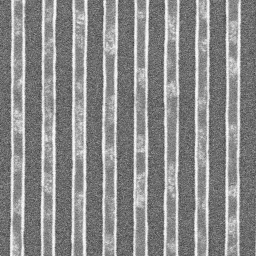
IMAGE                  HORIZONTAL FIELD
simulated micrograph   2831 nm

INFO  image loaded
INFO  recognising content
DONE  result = parallel lines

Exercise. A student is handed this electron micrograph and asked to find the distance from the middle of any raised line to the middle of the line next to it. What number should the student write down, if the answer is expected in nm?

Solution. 340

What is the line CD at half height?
131 nanometers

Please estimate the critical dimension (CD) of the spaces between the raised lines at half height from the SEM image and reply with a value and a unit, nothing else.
207 nanometres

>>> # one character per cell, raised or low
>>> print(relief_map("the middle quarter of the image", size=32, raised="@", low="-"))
--@@@-----@@@-----@@-----@@@----
--@@@-----@@@-----@@@----@@@----
--@@@-----@@@-----@@@----@@@----
--@@@-----@@@-----@@@----@@@----
---@@-----@@@-----@@@----@@@----
--@@@-----@@@-----@@@----@@@----
--@@@-----@@@-----@@@----@@@----
--@@@-----@@@-----@@@----@@@----
---@@-----@@@-----@@@----@@@----
---@@-----@@@-----@@@----@@@----
--@@@-----@@@-----@@@----@@@----
--@@@-----@@@-----@@-----@@@----
--@@@-----@@@-----@@@----@@@----
--@@@-----@@@-----@@@----@@@----
--@@@-----@@@-----@@@----@@@----
--@@@-----@@@-----@@@----@@@----
--@@@-----@@@-----@@@----@@@----
--@@@-----@@@-----@@@----@@@----
--@@@-----@@@-----@@@----@@@----
--@@@-----@@@-----@@@----@@@----
--@@@-----@@@-----@@@----@@@----
--@@@-----@@@-----@@@----@@@----
--@@@-----@@@-----@@@----@@@----
--@@@-----@@@-----@@@----@@@----
--@@@-----@@@-----@@-----@@@----
--@@@-----@@@-----@@-----@@@----
--@@@-----@@@-----@@-----@@@----
--@@@-----@@@-----@@------@@----
--@@@-----@@@-----@@------@@----
--@@@-----@@@-----@@------@@----
--@@@-----@@@-----@@------@@----
--@@@-----@@@-----@@------@@----